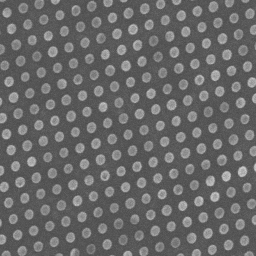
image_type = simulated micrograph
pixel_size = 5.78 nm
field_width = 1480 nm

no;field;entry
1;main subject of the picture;a regular array of raised bodies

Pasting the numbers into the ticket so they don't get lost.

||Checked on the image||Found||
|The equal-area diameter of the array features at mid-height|0.0549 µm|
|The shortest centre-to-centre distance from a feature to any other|0.0955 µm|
